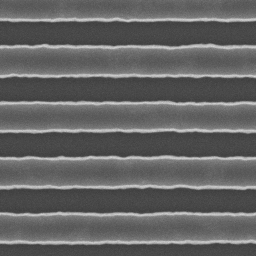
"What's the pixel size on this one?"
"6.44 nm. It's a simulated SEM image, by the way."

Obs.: parallel lines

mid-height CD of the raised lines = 0.187 microns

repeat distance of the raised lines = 358 nanometers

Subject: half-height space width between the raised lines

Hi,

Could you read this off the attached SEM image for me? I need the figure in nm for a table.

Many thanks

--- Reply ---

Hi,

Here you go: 168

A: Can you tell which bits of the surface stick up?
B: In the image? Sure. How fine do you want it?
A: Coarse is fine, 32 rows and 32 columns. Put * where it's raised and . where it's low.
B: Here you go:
********************************
********************************
.*******************************
................................
................................
................................
********************************
********************************
********************************
*.******.**...**.***************
................................
................................
................................
********************************
********************************
********************************
....*...........................
................................
................................
................................
********************************
********************************
********************************
*......*.....*..........**...**.
................................
................................
................................
********************************
********************************
********************************
................................
................................